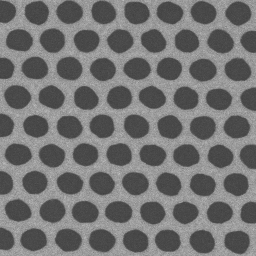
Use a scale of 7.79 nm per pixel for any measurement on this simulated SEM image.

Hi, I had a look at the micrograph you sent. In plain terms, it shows a regular array of holes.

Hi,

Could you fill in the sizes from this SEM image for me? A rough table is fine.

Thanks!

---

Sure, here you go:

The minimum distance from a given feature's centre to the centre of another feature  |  0.254 µm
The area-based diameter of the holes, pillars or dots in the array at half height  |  188 nm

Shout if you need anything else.